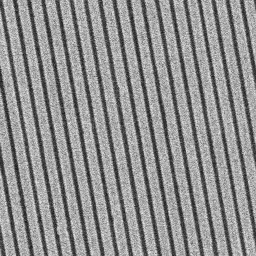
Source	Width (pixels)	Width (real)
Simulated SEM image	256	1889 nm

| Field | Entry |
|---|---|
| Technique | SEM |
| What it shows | parallel lines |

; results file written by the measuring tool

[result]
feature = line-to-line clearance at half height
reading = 36.3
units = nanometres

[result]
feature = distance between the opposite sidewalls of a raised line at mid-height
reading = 0.0662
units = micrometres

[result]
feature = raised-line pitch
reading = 103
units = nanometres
